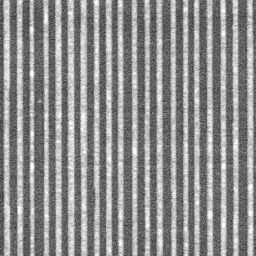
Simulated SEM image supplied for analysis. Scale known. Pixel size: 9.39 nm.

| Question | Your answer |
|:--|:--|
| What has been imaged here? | parallel lines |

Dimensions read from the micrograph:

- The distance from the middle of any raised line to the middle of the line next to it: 121 nanometers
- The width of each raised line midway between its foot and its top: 43.4 nm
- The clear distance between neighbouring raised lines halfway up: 75.2 nm